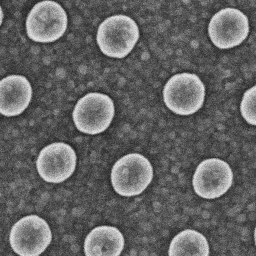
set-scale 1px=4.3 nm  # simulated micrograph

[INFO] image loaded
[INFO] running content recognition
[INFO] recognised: a regular array of raised bodies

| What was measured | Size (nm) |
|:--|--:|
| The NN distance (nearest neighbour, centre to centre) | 310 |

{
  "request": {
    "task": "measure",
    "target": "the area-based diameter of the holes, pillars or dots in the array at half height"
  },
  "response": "40.3 pixels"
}